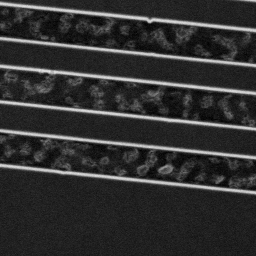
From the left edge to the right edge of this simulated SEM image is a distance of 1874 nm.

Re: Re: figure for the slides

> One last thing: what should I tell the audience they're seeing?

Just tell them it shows parallel lines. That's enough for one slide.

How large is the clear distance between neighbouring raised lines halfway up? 247 nm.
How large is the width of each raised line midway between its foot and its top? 211 nanometres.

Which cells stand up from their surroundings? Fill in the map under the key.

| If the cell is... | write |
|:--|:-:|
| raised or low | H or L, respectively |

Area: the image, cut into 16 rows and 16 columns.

LLHHHHHHHHHHHHHH
LLLLLLLLLLLLHHHH
HLLLLLLLLLLLLLLL
HHHHHHHHHHHLLLLL
LLLHHHHHHHHHHHHH
LLLLLLLLLLLLHHHH
HLLLLLLLLLLLLLLL
HHHHHHHHHHHLLLLL
LLLHHHHHHHHHHHHH
LLLLLLLLLLLLHHHH
HHLLLLLLLLLLLLLL
HHHHHHHHHHHLLLLL
HHHHHHHHHHHHHHHH
HHHHHHHHHHHHHHHH
HHHHHHHHHHHHHHHH
HHHHHHHHHHHHHHHH